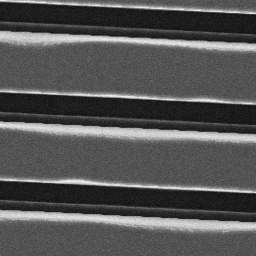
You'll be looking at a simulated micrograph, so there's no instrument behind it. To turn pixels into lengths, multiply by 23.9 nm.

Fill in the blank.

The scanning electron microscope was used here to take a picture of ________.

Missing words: lines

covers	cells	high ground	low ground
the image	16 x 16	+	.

.........+++++++
................
++++++++++......
++++++++++++++++
++++++++++++++++
++++++++++++++++
................
................
++++++++++++++++
++++++++++++++++
++++++++++++++++
.....+++++++++++
................
+++++++.........
++++++++++++++++
++++++++++++++++